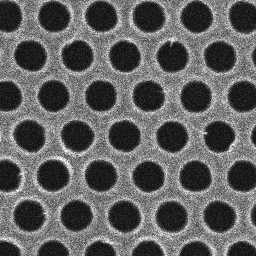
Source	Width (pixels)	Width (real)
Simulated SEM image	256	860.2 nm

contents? a regular array of holes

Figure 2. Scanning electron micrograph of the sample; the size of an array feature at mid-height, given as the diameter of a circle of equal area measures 30.4 px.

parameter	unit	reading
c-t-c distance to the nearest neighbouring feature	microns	0.155